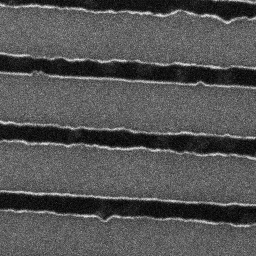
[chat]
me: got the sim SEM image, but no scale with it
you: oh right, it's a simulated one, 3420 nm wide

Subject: one or a few lines or trenches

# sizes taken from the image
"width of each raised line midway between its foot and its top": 253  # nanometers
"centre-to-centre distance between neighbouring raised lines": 914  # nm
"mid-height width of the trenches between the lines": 659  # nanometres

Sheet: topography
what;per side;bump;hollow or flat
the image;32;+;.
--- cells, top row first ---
++++++++++++++++++++++++++++++++
...........++.+.++++++.+++++++++
............................+...
................................
................................
................................
................................
+++++++++.+...+.................
++++++++++++++++++++++++++++++++
......++++++++++++++++++++++++++
......................+++.++++++
................................
................................
................................
................................
++.+............................
++++++++++++++++++..............
++++++++++++++++++++++++++++++++
.............+++++++++++++++++++
..............................++
................................
................................
................................
................................
++++++++++......................
++++++++++++++++++++++++++++.+..
.....+++++++++++++++++++++++++++
.......................+++++++++
................................
................................
................................
................................